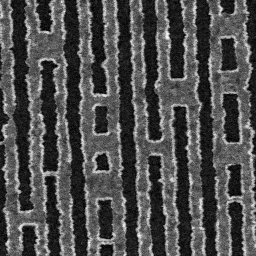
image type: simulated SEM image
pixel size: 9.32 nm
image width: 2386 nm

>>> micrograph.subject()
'parallel lines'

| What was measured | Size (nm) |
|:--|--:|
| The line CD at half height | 120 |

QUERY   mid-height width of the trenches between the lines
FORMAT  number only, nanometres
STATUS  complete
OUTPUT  120